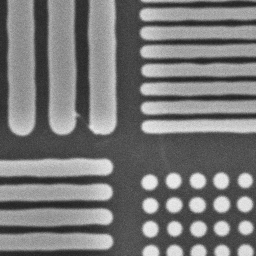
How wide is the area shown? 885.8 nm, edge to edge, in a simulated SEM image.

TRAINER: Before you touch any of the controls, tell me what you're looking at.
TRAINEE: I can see groups of lines, slits or small figures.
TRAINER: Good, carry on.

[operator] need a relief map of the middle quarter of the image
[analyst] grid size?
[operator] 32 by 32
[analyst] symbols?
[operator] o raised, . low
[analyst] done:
ooo....oooooo.......oooooooooooo
ooo....oooooo......ooooooooooooo
ooo....oooooo.......oooooooooooo
ooo....oooooo...................
ooo....oooooo...................
ooo....oooooo......ooooooooooooo
ooo....oooooo......ooooooooooooo
ooo....oooooo.......oooooooooooo
ooo....oooooo...................
ooo....oooooo..............ooooo
oo.....oooooo......ooooooooooooo
ooo....oooooo......ooooooooooooo
ooo....oooooo........oo.........
ooo....oooooo...................
ooo....oooooo.......oooooooooooo
ooo....oooooo.......oooooooooooo
oo.....ooooo........oooooooooooo
................................
................................
................................
................................
................................
................................
................................
oooooooooooo....................
oooooooooooo....................
oooooooooooo....................
ooooooooooo................o....
....................ooo...ooo...
....................ooo...ooo...
ooooooooooo.........ooo...ooo...
oooooooooooo....................